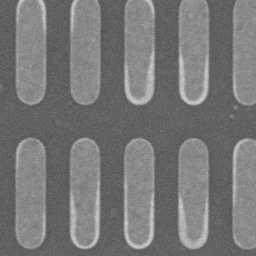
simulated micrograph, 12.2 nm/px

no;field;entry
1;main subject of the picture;groups of lines, slits or small figures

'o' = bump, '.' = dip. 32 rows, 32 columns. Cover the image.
..ooo....ooo....ooo....ooo...ooo
..oooo...ooo....ooo...oooo...ooo
..oooo...ooo....ooo...oooo...ooo
..oooo...ooo....ooo...oooo...ooo
..oooo...ooo....ooo...oooo...ooo
..oooo...ooo....ooo...oooo...ooo
..oooo...ooo....ooo...oooo...ooo
..oooo...ooo....ooo....ooo...ooo
..oooo...ooo....ooo....ooo...ooo
..oooo...ooo....ooo....ooo...ooo
..oooo...ooo....ooo....ooo...ooo
..oooo...ooo....ooo....ooo...ooo
...oo....ooo.....o.....oo.....oo
................................
................................
................................
................................
...oo.....o......o......o.....oo
..ooo....ooo....ooo....ooo....oo
..oooo...ooo....ooo...oooo...ooo
..oooo...ooo....ooo...oooo...ooo
..oooo...ooo....ooo...oooo...ooo
..oooo...ooo....ooo...oooo...ooo
..oooo...ooo....ooo...oooo...ooo
..oooo...ooo....ooo...oooo...ooo
..oooo...ooo....ooo....ooo...ooo
..oooo...ooo....ooo....ooo...ooo
..oooo...ooo....ooo....ooo...ooo
..oooo...ooo....ooo....ooo...ooo
..oooo...ooo....ooo....ooo...ooo
...oo.....oo....oo......o.....oo
................................